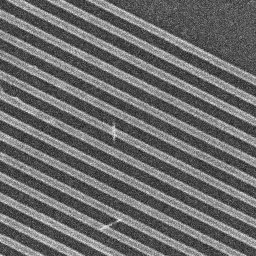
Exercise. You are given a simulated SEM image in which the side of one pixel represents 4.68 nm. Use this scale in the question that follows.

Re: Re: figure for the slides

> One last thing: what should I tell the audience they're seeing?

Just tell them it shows parallel lines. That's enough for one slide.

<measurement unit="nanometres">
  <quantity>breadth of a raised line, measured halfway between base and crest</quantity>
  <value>30.3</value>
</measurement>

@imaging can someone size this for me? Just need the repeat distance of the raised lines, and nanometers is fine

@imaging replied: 85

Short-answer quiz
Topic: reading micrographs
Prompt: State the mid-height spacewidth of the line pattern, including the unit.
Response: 52.7 nanometres